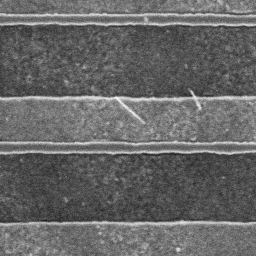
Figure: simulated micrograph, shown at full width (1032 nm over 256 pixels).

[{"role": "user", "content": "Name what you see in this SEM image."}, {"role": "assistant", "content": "lines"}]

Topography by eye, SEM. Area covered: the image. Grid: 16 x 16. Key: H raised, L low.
HHHHHHHHHHHHHHHH
HHHLHHHHLHHHHHHH
LLLLLLLLLLLLLLLL
LLLLLLLLLLLLLLLL
LLLLLLLLLLLLLLLL
LLLLLLLLLLLLLLLL
HHHHHHHHHHHHHHHH
HHHHHHHHHHHHHHHH
HHHHHHHHHHHHHHHH
HHHHHHHHHHHHHHHH
LLLLLLLLLLLLLLLL
LLLLLLLLLLLLLLLL
LLLLLLLLLLLLLLLL
LLLLLLLLLLLLLLLL
HHHHHHHHHHHHHHHH
HHHHHHHHHHHHHHHH